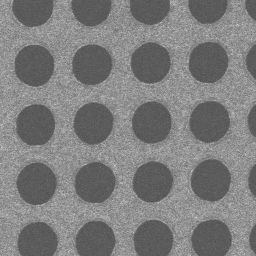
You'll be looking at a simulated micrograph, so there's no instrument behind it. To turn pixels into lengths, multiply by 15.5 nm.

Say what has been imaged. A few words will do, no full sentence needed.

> a regular array of holes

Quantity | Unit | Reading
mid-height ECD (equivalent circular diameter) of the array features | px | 41.3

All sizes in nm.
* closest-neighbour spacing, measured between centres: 893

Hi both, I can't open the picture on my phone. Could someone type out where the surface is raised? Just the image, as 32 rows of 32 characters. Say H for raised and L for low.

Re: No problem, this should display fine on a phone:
HHLLLLLHHLLLLLHHLLLLLHHLLLLLHHHL
HHLLLLLHHLLLLLHHLLLLLHHHLLLLHHHL
HHLLLLHHHHLLLHHHHLLLHHHHHLLHHHHH
HHHHHHHHHHHHHHHHHHHHHHHHHHHHHHHH
HHHHHHHHHHHHHHHHHHHHHHHHHHHHHHHH
HHHHHHHHHHHHHHHHHHLLHHHHHLLHHHHH
HHLLLLHHHLLLLLHHHLLLLHHHLLLLHHHL
HHLLLLLHHLLLLLHHLLLLLHHHLLLLLHHL
HHLLLLLHHLLLLLHHLLLLLHHHLLLLHHHL
HHLLLLHHHLLLLLHHHLLLLHHHLLLLHHHH
HHHLLLHHHHLLHHHHHHHHHHHHHHHHHHHH
HHHHHHHHHHHHHHHHHHHHHHHHHHHHHHHH
HHHHHHHHHHHHHHHHHHHHHHHHHHHHHHHH
HHHLLLHHHHLLLHHHHLLLLHHHLLLLHHHL
HHLLLLLHHLLLLLHHHLLLLHHHLLLLLHHL
HHLLLLLHHLLLLLHHLLLLLHHHLLLLLHHL
HHLLLLLHHLLLLLHHHLLLLHHHLLLLHHHL
HHHLLLHHHHLLLHHHHLLLHHHHHLLHHHHH
HHHHHHHHHHHHHHHHHHHHHHHHHHHHHHHH
HHHHHHHHHHHHHHHHHHHHHHHHHHHHHHHH
HHHHLHHHHHHLLHHHHHLLHHHHHLLLHHHH
HHHLLLLHHHLLLLHHHLLLLHHHLLLLLHHL
HHLLLLLHHLLLLLHHHLLLLLHHLLLLLHHL
HHLLLLLHHLLLLLHHHLLLLHHHLLLLLHHL
HHLLLLLHHHLLLLHHHLLLLHHHHLLLHHHH
HHHHLHHHHHHHHHHHHHHHHHHHHHHHHHHH
HHHHHHHHHHHHHHHHHHHHHHHHHHHHHHHH
HHHHHHHHHHHHHHHHHHLLHHHHHHLHHHHH
HHHLLLHHHHLLLLHHHLLLLHHHLLLLLHHH
HHLLLLLHHLLLLLHHHLLLLLHHLLLLLHHL
HHLLLLLHHLLLLLHHHLLLLLHHLLLLLHHL
HHLLLLLHHHLLLLHHHLLLLHHHLLLLHHHH